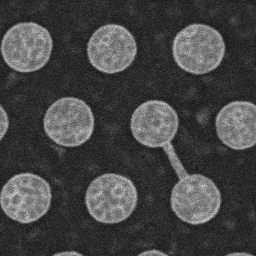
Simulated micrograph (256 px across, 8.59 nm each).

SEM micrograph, raised bodies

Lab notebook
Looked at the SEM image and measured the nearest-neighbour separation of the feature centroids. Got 731 nanometers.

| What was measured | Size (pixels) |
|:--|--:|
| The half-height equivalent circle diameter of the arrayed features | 48.9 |